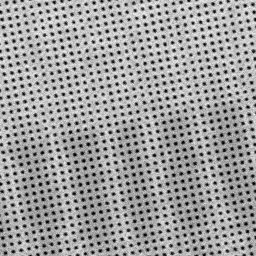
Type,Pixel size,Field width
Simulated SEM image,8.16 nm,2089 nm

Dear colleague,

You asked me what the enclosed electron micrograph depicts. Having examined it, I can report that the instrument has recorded a regular array of holes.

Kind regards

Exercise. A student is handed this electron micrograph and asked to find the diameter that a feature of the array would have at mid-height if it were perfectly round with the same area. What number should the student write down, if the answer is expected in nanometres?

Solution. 35.6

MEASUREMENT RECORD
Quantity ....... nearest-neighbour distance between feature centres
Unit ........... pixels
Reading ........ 7.41